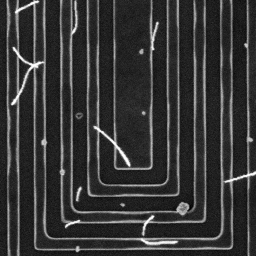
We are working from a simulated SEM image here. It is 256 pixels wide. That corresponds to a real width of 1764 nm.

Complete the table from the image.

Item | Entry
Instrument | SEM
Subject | groups of lines, slits or small figures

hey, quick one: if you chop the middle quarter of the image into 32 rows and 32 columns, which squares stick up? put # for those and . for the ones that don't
##....##.....#########....###...
##....##.....#########....###...
##....##.....#########....###...
##....##.....#########....###...
##....##.....#########....###...
##....##.....#########....###...
##....###....#########....###...
##....###....#########....###...
##....###....#########....###...
##....##.....#########....###...
##....##.....#########....###...
##....##.....#########....###...
##....##.....#########....###...
##....##.....#########....###...
##....##.....#########....###...
##....###....#########....###...
##....###....#########....###...
##....###....#########....###...
##....###....#########....###...
##....##....##########....###...
##....##.....#########....###...
##....##.....#########....##....
##....##.....#########....##....
##....###....#########....##....
##....###....#########....##....
##....###....#########....##....
##....###.................##....
##....###.................###...
##....###.................###...
##....###................####...
##....#######################...
##....#######################...